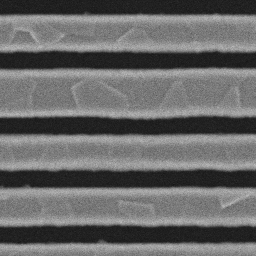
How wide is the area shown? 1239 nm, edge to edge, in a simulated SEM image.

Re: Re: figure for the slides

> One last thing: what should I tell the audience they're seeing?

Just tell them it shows lines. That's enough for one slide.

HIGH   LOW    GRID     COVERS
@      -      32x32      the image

--------------------------------
--------------------------------
@@@@@@@@@@@@@@@@@@@@@@@@@@@@@@@@
@@@@@@@@@@@@@@@@@@@@@@@@@@@@@@@@
@@@@@@@@@@@@@@@@@@@@@@@@@@@@@@@@
@@@@@@@@@@@@@@@@@@@@@@@@@@@@@@@@
------------------------@-------
--------------------------------
--------------------------------
@@@@@@@@@@@@@@@@@@@@@@@@@@@@@@@@
@@@@@@@@@@@@@@@@@@@@@@@@@@@@@@@@
@@@@@@@@@@@@@@@@@@@@@@@@@@@@@@@@
@@@@@@@@@@@@@@@@@@@@@@@@@@@@@@@@
@@@@@@@@@@@@@@@@@@@@@@@@@@@@@@@@
@@@@@@@@@@@@@@@@@@@@@@@@---@@@@@
--------------------------------
--------------------------------
@@@@@@@@@@@@@@@@@@@@@@@@@@@@@@@@
@@@@@@@@@@@@@@@@@@@@@@@@@@@@@@@@
@@@@@@@@@@@@@@@@@@@@@@@@@@@@@@@@
@@@@@@@@@@@@@@@@@@@@@@@@@@@@@@@@
--------------------------------
--------------------------------
--------------------------------
@@@@@@@@@@@@@@@@@@@@@@@@@@@@@@@@
@@@@@@@@@@@@@@@@@@@@@@@@@@@@@@@@
@@@@@@@@@@@@@@@@@@@@@@@@@@@@@@@@
@@@@@@@@@@@@@@@@@@@@@@@@@@@@@@@@
--------------------------------
--------------------------------
-------@@@@@@@--@@@@@@@@@@@@@@@@
@@@@@@@@@@@@@@@@@@@@@@@@@@@@@@@@